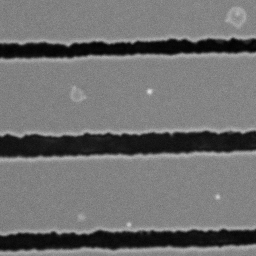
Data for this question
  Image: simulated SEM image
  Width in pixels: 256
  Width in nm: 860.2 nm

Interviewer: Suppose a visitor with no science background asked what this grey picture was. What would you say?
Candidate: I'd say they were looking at lines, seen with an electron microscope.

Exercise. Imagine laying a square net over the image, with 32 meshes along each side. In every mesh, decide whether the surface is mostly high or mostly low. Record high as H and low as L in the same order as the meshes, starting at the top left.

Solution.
HHHHHHHHHHHHHHHHHHHHHHHHHHHHHHHH
HHHHHHHHHHHHHHHHHHHHHHHHHHHHHHHH
HHHHHHHHHHHHHHHHHHHHHHHHHHHHHHHH
HHHHHHHHHHHHHHHHHHHHHHHHHHHHHHHH
HHHHHHHHHHHHHHHHHHHHHHHHHHHHHHHH
LLHLLLLLHLLLLLLLLLLLLLLLLLLLLLLL
LLLLLLLLLLLLLLLLLLLLLLLLLLHLLLHL
HHHHHHHHHHHHHHHHHHHHHHHHHHHHHHHH
HHHHHHHHHHHHHHHHHHHHHHHHHHHHHHHH
HHHHHHHHHHHHHHHHHHHHHHHHHHHHHHHH
HHHHHHHHHHHHHHHHHHHHHHHHHHHHHHHH
HHHHHHHHHHHHHHHHHHHHHHHHHHHHHHHH
HHHHHHHHHHHHHHHHHHHHHHHHHHHHHHHH
HHHHHHHHHHHHHHHHHHHHHHHHHHHHHHHH
HHHHHHHHHHHHHHHHHHHHHHHHHHHHHHHH
HHHHHHHHHHHHHHHHHHHHHHHHHHHHHHHH
HHHHHHHHHHHHHHHHHHHHHHHHHLLHLLHL
LLLLLLLLLLLLLLLLLLLLLLLLLLLLLLLL
LLLLLLLLLLLLLLLLLLLLLLLLLLLLLLLL
LLLLLLHLHHHHHHHHHHHHHHHHHHHHHHHH
HHHHHHHHHHHHHHHHHHHHHHHHHHHHHHHH
HHHHHHHHHHHHHHHHHHHHHHHHHHHHHHHH
HHHHHHHHHHHHHHHHHHHHHHHHHHHHHHHH
HHHHHHHHHHHHHHHHHHHHHHHHHHHHHHHH
HHHHHHHHHHHHHHHHHHHHHHHHHHHHHHHH
HHHHHHHHHHHHHHHHHHHHHHHHHHHHHHHH
HHHHHHHHHHHHHHHHHHHHHHHHHHHHHHHH
HHHHHHHHHHHHHHHHHHHHHHHHHHHHHHHH
HHHHHHHHHHHHHHHHHHHHHHHHHHHHHHHH
LLLLLLLLLLLLLLLLLLLLLLLLLLLLLLLL
LLLLLLLLLLLLLLLLLLLLLLLLLLLLLLLL
HHHHHHHHHHHHHHHHHHHHHHHHHHHHHHHH